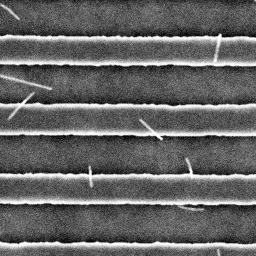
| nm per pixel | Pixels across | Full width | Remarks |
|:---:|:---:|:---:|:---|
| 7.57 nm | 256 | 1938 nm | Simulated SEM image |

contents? lines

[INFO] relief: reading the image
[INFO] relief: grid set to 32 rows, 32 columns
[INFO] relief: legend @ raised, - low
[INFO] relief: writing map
--------------------------------
--------------------------------
--------------------------------
--------------------------------
-@------------------------------
@@@@@@@@@@@@@@@@@@@@@@@@@@@@@@@@
@@@@@@@@@@@@@@@@@@@@@@@@@@@@@@@@
@@@@@@@@@@@@@@@@@@@@@@@@@@@@@@@@
--------------------------------
--------------------------------
--------------------------------
--------------------------------
--------------------------------
@@@@@@@@@@@@@@@@@@@@@@@@@@@@@@@@
@@@@@@@@@@@@@@@@@@@@@@@@@@@@@@@@
@@@@@@@@@@@@@@@@@@@@@@@@@@@@@@@@
@@@@@@@@@@@@@@@@@@@@@@@@@@@@@@@@
--------------------------------
--------------------------------
--------------------------------
--------------------------------
--------------------------------
@@@@@@@@@@@@@@@@@@@@@@@@@@@@@@@@
@@@@@@@@@@@@@@@@@@@@@@@@@@@@@@@@
@@@@@@@@@@@@@@@@@@@@@@@@@@@@@@@@
--------------------@-@-@@@@-@@@
--------------------------------
--------------------------------
--------------------------------
--------------------------------
@-@@@@@@-@@@@@@@@--@@@----@@@---
@@@@@@@@@@@@@@@@@@@@@@@@@@@@@@@@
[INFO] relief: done